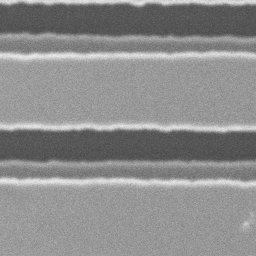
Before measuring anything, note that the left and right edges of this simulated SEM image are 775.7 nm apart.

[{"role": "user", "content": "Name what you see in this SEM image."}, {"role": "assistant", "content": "lines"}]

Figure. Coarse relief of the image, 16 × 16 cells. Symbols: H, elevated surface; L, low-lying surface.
LLLLLLLLLLLLLLLL
LLLLLLLLLLLLLLLL
HHHHHHHHHHHHHHHH
HHHHHHHHHHHHHHHH
HHHHHHHHHHHHHHHH
HHHHHHHHHHHHHHHH
HHHHHHHHHHHHHHHH
HHHHHHHHHHHHHHHH
LLLLLLLLLLLLLLLL
LLLLLLLLLLLLLLLL
HHHHHHHHHHHHHHHH
HHHHHHHHHHHHHHHH
HHHHHHHHHHHHHHHH
HHHHHHHHHHHHHHHH
HHHHHHHHHHHHHHHH
HHHHHHHHHHHHHHHH